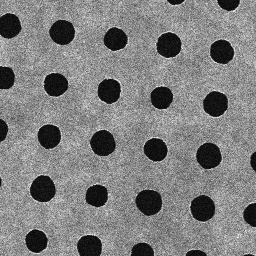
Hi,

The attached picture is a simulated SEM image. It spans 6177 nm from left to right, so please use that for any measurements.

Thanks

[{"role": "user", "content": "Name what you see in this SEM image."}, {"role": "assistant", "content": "a regular array of holes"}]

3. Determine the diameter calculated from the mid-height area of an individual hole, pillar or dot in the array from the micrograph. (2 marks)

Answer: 587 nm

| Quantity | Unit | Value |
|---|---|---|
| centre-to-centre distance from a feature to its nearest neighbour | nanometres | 1260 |